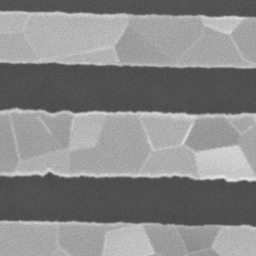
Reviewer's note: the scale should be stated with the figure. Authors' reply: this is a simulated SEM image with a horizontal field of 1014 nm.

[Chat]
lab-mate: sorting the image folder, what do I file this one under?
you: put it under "lines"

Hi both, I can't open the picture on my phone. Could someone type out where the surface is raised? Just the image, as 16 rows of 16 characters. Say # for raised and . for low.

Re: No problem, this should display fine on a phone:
................
################
################
################
................
................
................
################
################
################
################
................
................
................
################
################